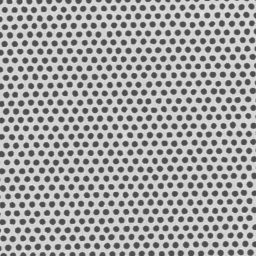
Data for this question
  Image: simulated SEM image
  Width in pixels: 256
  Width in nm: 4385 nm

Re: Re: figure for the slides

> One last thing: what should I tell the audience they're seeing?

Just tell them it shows a regular array of holes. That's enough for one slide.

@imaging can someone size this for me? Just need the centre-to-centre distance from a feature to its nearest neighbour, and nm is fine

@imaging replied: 158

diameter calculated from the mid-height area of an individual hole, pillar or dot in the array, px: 6.39